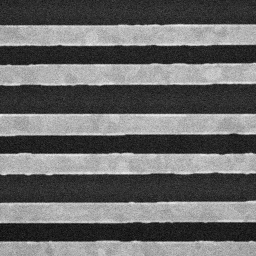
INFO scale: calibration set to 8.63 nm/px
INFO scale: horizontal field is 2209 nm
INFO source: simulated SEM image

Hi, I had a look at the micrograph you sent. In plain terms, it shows lines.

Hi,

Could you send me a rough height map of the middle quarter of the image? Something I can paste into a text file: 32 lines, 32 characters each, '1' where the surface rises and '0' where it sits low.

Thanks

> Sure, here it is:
11111111111111111111111111111111
11111111111111111111111111111111
11111111111111111111111111111111
11111111111111111111111111111111
11111111111111111111111111111111
00000000000000000000000000000000
00000000000000000000000000000000
00000000000000000000000000000000
00000000000000000000000000000000
00000000000000000000000000000000
00000000000000000000000000000000
00000000000000000000000000000000
00000000000000000000000000000000
11111111111111111111111111111111
11111111111111111111111111111111
11111111111111111111111111111111
11111111111111111111111111111111
11111111111111100000000000000000
00000000000000000000000000000000
00000000000000000000000000000000
00000000000000000000000000000000
00000000000000000000000000000000
00000000000011111000000000000000
11111111111111111111111111111111
11111111111111111111111111111111
11111111111111111111111111111111
11111111111111111111111111111111
00000000000000000000000000000000
00000000000000000000000000000000
00000000000000000000000000000000
00000000000000000000000000000000
00000000000000000000000000000000